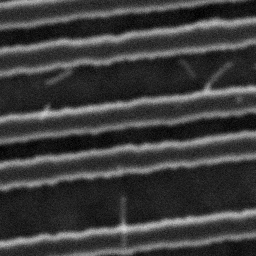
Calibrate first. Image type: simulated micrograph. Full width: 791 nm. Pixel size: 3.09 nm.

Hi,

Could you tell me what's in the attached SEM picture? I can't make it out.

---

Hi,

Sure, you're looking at lines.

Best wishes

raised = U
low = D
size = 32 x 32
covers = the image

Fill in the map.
UUUUUUUUUUUUUUUUUUUUUUUUUDDDDDDD
UUUUUUUUUUUUUUUUDDDDDDDDDDDDDDDD
UUUUUUUUUDDDDDDDDDDDDDDDDDDDDDUU
UDDDDDDDDDDDDDDDDDDDDDUUUUUUUUUU
DDDDDDDDDDDDDDDUUUUUUUUUUUUUUUUU
DDDDDUUUUUUUUUUUUUUUUUUUUUUUUUUD
UUUUUUUUUUUUUUUUUUUUUUUUUDDDDDDD
UUUUUUUUUUUUUUUDDDDDDDDDDDDDDDDD
UUUUUUUDDDDDDDDDDDDDDDDDDDDDDDDD
DDDDDDDDDDDDDDDDDDDDDDDDDDDDDDDD
DDDDDDDDDDDDDDDDDDDDDDDDDDDDDDDD
DDDDDDDDDDDDDDDDDDDDDDDDDUUUUUUU
DDDDDDDDDDDDDDDDDUUUUUUUUUUUUUUU
DDDDDDDDDDDUUUUUUUUUUUUUUUUUUUUU
DDDUUUUUUUUUUUUUUUUUUUUUUUUUUDDD
UUUUUUUUUUUUUUUUUUUUDUDDDDDDDDDD
UUUUUUUUUUUUDDDDDDDDDDDDDDDDDDDD
UUUDDDDDDDDDDDDDDDDDDDDDDUUUUUUU
DDDDDDDDDDDDDDUUUUUUUUUUUUUUUUUU
DDDDDDDDUUUUUUUUUUUUUUUUUUUUUUUU
UUUUUUUUUUUUUUUUUUUUUUUUUDDDDDDD
UUUUUUUUUUUUUUUUDDDDDDDDDDDDDDDD
UUUUUUUUDDDDDDDDDDDDDDDDDDDDDDDD
UDDDDDDDDDDDDDDDDDDDDDDDDDDDDDDD
DDDDDDDDDDDDDDDDDDDDDDDDDDDDDDDD
DDDDDDDDDDDDDDDDDDDDDDDDDDDDDDDD
DDDDDDDDDDDDDDDDDDDDDDDDDDDDDDDU
DDDDDDDDDDDDDDDDDDDDDDUUUUUUUUUU
DDDDDDDDDDDDDDDUUUUUUUUUUUUUUUUU
DDDDDDDUUUUUUUUUUUUUUUUUUUUUUUUU
UUUUUUUUUUUUUUUUUUUUUUUUUUDDDDDD
UUUUUUUUUUUUUUUUUDDDDDDDDDDDDDDD